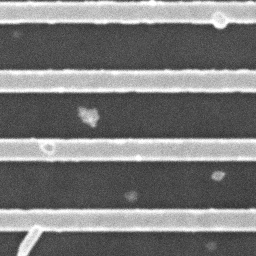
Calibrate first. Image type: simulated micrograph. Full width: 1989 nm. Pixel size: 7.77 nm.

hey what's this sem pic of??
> lines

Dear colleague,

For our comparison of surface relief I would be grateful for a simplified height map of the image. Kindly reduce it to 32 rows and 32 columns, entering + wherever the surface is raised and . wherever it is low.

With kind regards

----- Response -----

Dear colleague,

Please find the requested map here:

++++++++++++++++++++++++++++++++
++++++++++++++++++++++++++++++++
++++++++++++++++++++++++++++++++
................................
................................
................................
................................
................................
................................
++++++++++++++++++++++++++++++++
++++++++++++++++++++++++++++++++
................................
................................
................................
................................
................................
................................
++++++++.+++++++++++++++++++++++
++++++++++++++++++++++++++++++++
++++++++++++++++++++++++++++++++
................................
................................
................................
................................
................................
................................
++++++++++++++++++++++++++++++++
++++++++++++++++++++++++++++++++
++++++++++++++++++++++++++++++++
...++...........................
...+............................
..++............................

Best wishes